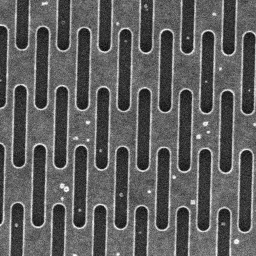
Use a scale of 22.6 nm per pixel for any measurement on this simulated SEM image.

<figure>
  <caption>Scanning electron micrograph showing groups of lines, slits or small figures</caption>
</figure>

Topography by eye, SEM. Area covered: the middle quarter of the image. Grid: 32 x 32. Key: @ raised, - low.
@@@----@@@@@@----@@@@@@@---@@@@@
@@@----@@@@@@----@@@@@@@---@@@@@
@@@----@@@@@@----@@@@@@@---@@@@@
@@@----@@@@@@----@@@@@@@---@@@@@
@@@---@@@@@@@----@@@@@@@---@@@@@
@@@---@@@@@@@----@@@@@@@---@@@@@
-@@---@@---@@----@@--@@@---@@@-@
-@@---@@---@@----@@---@@---@@---
-@@---@@----@----@@---@@---@@---
-@@---@@---@@----@@---@@---@@---
-@@---@@---@@---@@----@@---@@---
-@@@-@@@---@@@--@@----@@--@@@---
-@@@@@@@---@@@@@@@----@@@@@@@---
-@@@@@@@---@@@@@@@----@@@@@@@---
-@@@@@@@---@@@@@@@----@@@@@@@---
-@@@@@@@---@@@@@@@----@@@@@@@---
-@@@@@@@---@@@@@@@----@@@@@@@---
-@@@@@@@---@@@@@@@----@@@@@@@---
-@@@@@@@---@@@@@@@----@@@@@@----
-@@@@@@@---@@@@@@@----@@@@@@----
-@@@-@@@---@@@@@@@----@@@@@@----
-@@---@@---@@---@@----@@--@@----
-@@---@@---@@---@@----@----@----
-@@---@@---@@---@@----@----@----
-@----@@---@@---@@----@----@----
@@----@@---@@---@@---@@----@----
@@----@@@@@@@---@@@--@@----@@--@
@@----@@@@@@@---@@@@@@@----@@@@@
@@----@@@@@@@---@@@@@@@----@@@@@
@@----@@@@@@@---@@@@@@@----@@@@@
@@----@@@@@@@---@@@@@@@---@@@@@@
@@----@@@@@@@---@@@@@@@---@@@@@@